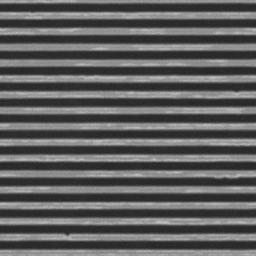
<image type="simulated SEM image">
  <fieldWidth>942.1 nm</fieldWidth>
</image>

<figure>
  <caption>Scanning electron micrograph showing parallel lines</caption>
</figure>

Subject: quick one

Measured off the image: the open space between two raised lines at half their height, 0.0322 µm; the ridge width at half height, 25.7 nm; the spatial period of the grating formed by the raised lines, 58.1 nm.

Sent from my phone